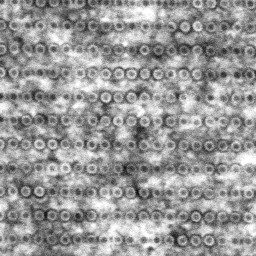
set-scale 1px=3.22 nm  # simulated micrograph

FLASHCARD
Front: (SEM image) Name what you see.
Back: a regular array of raised bodies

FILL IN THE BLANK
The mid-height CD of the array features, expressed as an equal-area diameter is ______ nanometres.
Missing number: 29.5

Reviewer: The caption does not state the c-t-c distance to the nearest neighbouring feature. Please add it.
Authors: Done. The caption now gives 13 px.